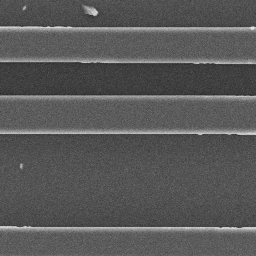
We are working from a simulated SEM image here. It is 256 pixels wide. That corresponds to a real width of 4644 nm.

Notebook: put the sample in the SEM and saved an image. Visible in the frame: lines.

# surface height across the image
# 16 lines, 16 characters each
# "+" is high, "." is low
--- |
................
................
++++++++++++++++
++++++++++++++++
................
................
++++++++++++++++
++++++++++++++++
................
................
................
................
................
................
++++++++++++++++
++++++++++++++++